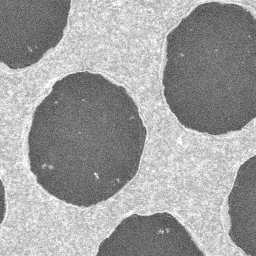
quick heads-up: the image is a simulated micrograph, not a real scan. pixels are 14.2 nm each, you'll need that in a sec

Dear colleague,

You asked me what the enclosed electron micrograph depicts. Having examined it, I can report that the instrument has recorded holes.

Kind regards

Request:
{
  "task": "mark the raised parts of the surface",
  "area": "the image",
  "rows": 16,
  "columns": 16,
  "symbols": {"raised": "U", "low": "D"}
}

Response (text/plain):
DDDDUUUUUUUUDDDU
DDDDUUUUUUUDDDDD
DDDDUUUUUUDDDDDD
DDDUUUUUUUDDDDDD
UUUUUUUUUUDDDDDD
UUUDDDDDUUDDDDDD
UUDDDDDDDUDDDDDD
UUDDDDDDDUUDDDDD
UUDDDDDDDUUUUUUU
UUDDDDDDDUUUUUUU
UUDDDDDDDUUUUUUD
UUDDDDDDUUUUUUUD
UUUUDDDUUUUUUUDD
UUUUUUUUDDDUUUDD
UUUUUUUDDDDDUUDD
UUUUUUDDDDDDDUUD